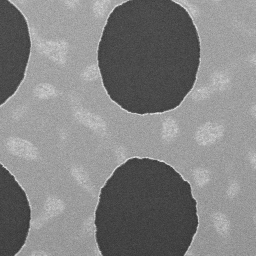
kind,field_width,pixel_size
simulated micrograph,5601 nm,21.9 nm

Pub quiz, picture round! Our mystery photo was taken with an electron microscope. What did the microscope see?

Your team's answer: holes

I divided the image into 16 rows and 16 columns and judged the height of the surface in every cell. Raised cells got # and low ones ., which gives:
.######....#####
..#####.....####
..####......####
..####.......###
..####......####
.######.....####
#######....#####
################
################
################
#######....#####
.######.....####
..####......####
..####......####
..####......####
.#####......####